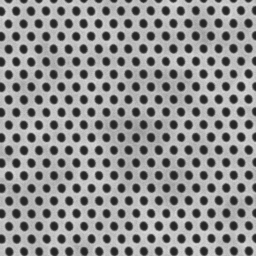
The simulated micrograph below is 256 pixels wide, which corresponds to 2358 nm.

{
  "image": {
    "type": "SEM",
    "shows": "a regular array of holes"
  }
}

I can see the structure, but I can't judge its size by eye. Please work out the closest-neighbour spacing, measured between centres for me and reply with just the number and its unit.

134 nm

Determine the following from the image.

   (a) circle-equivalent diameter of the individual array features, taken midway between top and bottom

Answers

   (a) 82.5 nm